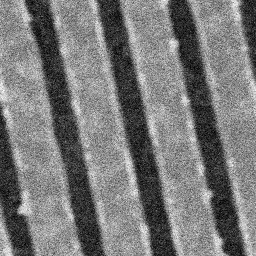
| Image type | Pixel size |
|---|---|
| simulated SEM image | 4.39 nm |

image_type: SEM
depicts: one or a few lines or trenches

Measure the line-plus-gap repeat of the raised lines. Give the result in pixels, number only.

69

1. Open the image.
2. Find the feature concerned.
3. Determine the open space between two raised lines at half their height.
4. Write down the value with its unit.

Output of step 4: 110 nanometers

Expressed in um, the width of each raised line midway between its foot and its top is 0.191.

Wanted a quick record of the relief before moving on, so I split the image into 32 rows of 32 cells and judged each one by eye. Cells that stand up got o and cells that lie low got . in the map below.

ooo...oooooo...oooooo...oooooo..
oooo...ooooo...oooooo...oooooo..
oooo...ooooo....ooooo...oooooo..
oooo...oooooo...ooooo....ooooo..
oooo...oooooo...oooooo...ooooo..
oooo....ooooo...oooooo...oooooo.
ooooo...ooooo....ooooo...oooooo.
ooooo...oooooo...ooooo....ooooo.
ooooo...oooooo...ooooo....ooooo.
ooooo...oooooo...oooooo...oooooo
oooooo...ooooo...oooooo...oooooo
oooooo...ooooo....ooooo...oooooo
oooooo...oooooo...oooooo...ooooo
oooooo...oooooo...oooooo...ooooo
.ooooo....ooooo...oooooo...ooooo
.ooooo....ooooo....ooooo...ooooo
.oooooo...ooooo....ooooo....oooo
.oooooo...oooooo...ooooo....oooo
..ooooo...oooooo...oooooo...oooo
..ooooo....ooooo....ooooo...oooo
..oooooo...oooooo...ooooo....ooo
..oooooo...oooooo...ooooo....ooo
..oooooo...oooooo...oooooo...ooo
...ooooo....ooooo...oooooo...ooo
...ooooo....ooooo....ooooo...ooo
...oooooo...ooooo....ooooo....oo
..ooooooo...oooooo...ooooo....oo
....ooooo....ooooo...oooooo...oo
o...ooooo....ooooo...oooooo...oo
o...ooooo....oooooo...ooooo...oo
o...oooooo...oooooo...oooooo...o
o...oooooo...oooooo...oooooo...o